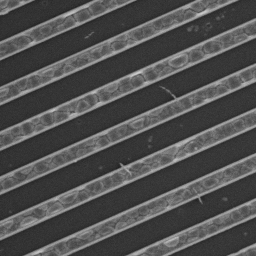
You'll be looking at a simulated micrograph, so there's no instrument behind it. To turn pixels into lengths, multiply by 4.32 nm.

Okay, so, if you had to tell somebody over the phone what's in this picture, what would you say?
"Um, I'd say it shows parallel lines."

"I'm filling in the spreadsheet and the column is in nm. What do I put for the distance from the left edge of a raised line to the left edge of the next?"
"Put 177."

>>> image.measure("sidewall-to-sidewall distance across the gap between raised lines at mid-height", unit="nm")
110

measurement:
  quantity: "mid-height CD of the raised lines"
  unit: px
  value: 15.8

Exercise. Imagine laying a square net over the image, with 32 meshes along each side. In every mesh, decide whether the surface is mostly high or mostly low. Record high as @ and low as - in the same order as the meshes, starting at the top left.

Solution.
@@@--------@@@@@--------@@@@----
@--------@@@@--------@@@@@------
------@@@@@--------@@@@@--------
----@@@@@--------@@@@@-------@@@
--@@@@@--------@@@@--------@@@@@
@@@@--------@@@@@--------@@@@@--
@@--------@@@@@--------@@@@@----
--------@@@@@-------@@@@@-------
------@@@@--------@@@@@--------@
---@@@@@--------@@@@@--------@@@
-@@@@@-------@@@@@@-------@@@@@-
@@@@-------@@@@@--------@@@@@---
@--------@@@@@--------@@@@@-----
-------@@@@@--------@@@@--------
----@@@@@@-------@@@@@--------@@
--@@@@@--------@@@@@--------@@@@
@@@@@--------@@@@--------@@@@@--
@@@--------@@@@--------@@@@@----
@-------@@@@@--------@@@@@------
------@@@@@--------@@@@@-------@
----@@@@--------@@@@@--------@@@
-@@@@@--------@@@@@--------@@@@@
@@@@--------@@@@@--------@@@@@--
@@--------@@@@@-------@@@@@-----
-------@@@@@--------@@@@@-------
-----@@@@@--------@@@@@-------@@
---@@@@@-------@@@@@@-------@@@@
-@@@@@-------@@@@@--------@@@@@-
@@@--------@@@@@--------@@@@@---
@--------@@@@@-------@@@@@------
------@@@@@--------@@@@@--------
----@@@@@--------@@@@@--------@@